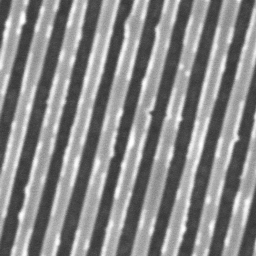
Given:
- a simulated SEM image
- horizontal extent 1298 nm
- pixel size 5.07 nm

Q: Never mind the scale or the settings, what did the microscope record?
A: parallel lines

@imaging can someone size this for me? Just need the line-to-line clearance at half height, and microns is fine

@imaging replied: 0.0714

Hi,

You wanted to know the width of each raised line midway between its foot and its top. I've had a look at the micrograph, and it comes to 75.6 nm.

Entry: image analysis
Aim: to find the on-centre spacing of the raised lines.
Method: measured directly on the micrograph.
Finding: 0.149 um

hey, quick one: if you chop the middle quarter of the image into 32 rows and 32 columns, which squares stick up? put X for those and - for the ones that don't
XX----XXXX---XXXX----XXXX----XXX
XX----XXXX---XXXX----XXXX----XXX
XX---XXXXX---XXXX----XXX----XXX-
XX---XXXX----XXXX---XXXX----XXX-
X----XXXX---XXXX----XXXX----XXX-
X----XXXX---XXXX----XXXX---XXXX-
X---XXXX----XXXX---XXXX----XXXX-
X---XXXX----XXX----XXXX----XXX--
----XXXX---XXXX----XXXX----XXX--
----XXXX---XXXX----XXXX---XXXX--
----XXX----XXXX---XXXX----XXXX--
---XXXX----XXXX---XXXX----XXX---
---XXXX---XXXX----XXX-----XXX---
---XXXX---XXXX----XXXX---XXXX---
---XXX----XXXX---XXXX----XXXX---
--XXXX----XXX----XXXX----XXXX---
--XXXX---XXXX----XXXX---XXXX----
--XXXX---XXXX---XXXXX---XXXX----
-XXXX----XXXX---XXXX----XXXX----
-XXXX----XXXX---XXXX----XXXX----
-XXXX---XXXX----XXXX---XXXX----X
XXXXX---XXXX----XXX----XXXX----X
XXXX----XXXX---XXXX----XXXX----X
XXXX----XXXX---XXXX----XXXX----X
XXXX----XXX----XXXX---XXXX-----X
XXXX---XXXX---XXXX----XXXX----XX
XXX----XXXX---XXXX----XXXX----XX
XXX----XXXX---XXXX----XXXX----XX
XXX----XXX----XXXX---XXXX----XXX
XXX---XXXX---XXXX----XXXX----XXX
XX----XXXX---XXXX----XXXX----XXX
XX----XXXX---XXXX----XXXX---XXXX